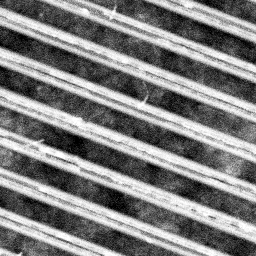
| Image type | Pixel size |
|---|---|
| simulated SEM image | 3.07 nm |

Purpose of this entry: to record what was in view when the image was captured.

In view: parallel lines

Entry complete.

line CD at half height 39.4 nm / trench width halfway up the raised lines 76.4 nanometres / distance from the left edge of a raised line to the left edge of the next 115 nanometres